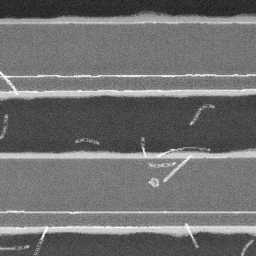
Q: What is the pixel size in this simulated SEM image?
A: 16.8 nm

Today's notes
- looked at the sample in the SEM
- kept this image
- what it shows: lines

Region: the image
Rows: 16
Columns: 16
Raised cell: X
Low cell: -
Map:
----------------
XXXXXXXXXXXXXXXX
XXXXXXXXXXXXXXXX
XXXXXXXXXXXXXXXX
XXXXXXXXXXXXXXXX
XXXXXXXXXXXXXXXX
----------------
----------------
----------------
----------------
XXXXXXXXXXXXXXXX
XXXXXXXXXXXXXXXX
XXXXXXXXXXXXXXXX
XXXXXXXXXXXXXXXX
----------------
----------------